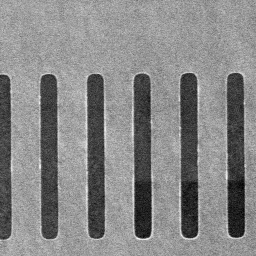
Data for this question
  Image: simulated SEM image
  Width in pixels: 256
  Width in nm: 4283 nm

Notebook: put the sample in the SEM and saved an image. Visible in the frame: groups of lines, slits or small figures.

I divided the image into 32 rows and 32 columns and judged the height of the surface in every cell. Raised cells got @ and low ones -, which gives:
@@@@@@@@@@@@@@@@@@@@@@@@@@@@@@@@
@@@@@@@@@@@@@@@@@@@@@@@@@@@@@@@@
@@@@@@@@@@@@@@@@@@@@@@@@@@@@@@@@
@@@@@@@@@@@@@@@@@@@@@@@@@@@@@@@@
@@@@@@@@@@@@@@@@@@@@@@@@@@@@@@@@
@@@@@@@@@@@@@@@@@@@@@@@@@@@@@@@@
@@@@@@@@@@@@@@@@@@@@@@@@@@@@@@@@
@@@@@@@@@@@@@@@@@@@@@@@@@@@@@@@@
@@@@@@@@@@@@@@@@@@@@@@@@@@@@@@@@
-@@@@--@@@@--@@@@--@@@@-@@@@@-@@
-@@@@--@@@@--@@@@--@@@---@@@---@
-@@@@--@@@@--@@@@--@@@---@@@---@
-@@@@--@@@@--@@@@--@@@---@@@---@
-@@@@--@@@@--@@@@--@@@---@@@---@
-@@@@--@@@@--@@@@--@@@---@@@---@
-@@@@--@@@@--@@@@--@@@---@@@---@
-@@@@--@@@@--@@@@--@@@---@@@---@
-@@@@--@@@@--@@@@--@@@---@@@---@
-@@@@--@@@@--@@@@--@@@---@@@---@
-@@@@--@@@@--@@@@--@@@---@@@---@
-@@@@--@@@@--@@@@--@@@---@@@---@
-@@@@--@@@@--@@@@--@@@---@@@---@
-@@@@--@@@@--@@@@--@@@---@@@---@
-@@@@--@@@@--@@@@--@@@---@@@---@
--@@@--@@@@--@@@@--@@@---@@@---@
--@@@--@@@@--@@@@--@@@---@@@---@
--@@@--@@@@--@@@@--@@@---@@@---@
--@@@--@@@@--@@@@--@@@---@@@---@
--@@@--@@@@--@@@@--@@@@--@@@---@
-@@@@--@@@@--@@@@--@@@@--@@@@-@@
@@@@@@@@@@@@@@@@@@@@@@@@@@@@@@@@
@@@@@@@@@@@@@@@@@@@@@@@@@@@@@@@@